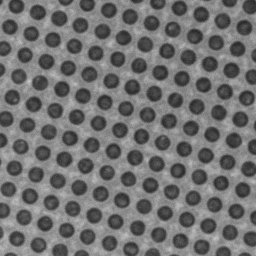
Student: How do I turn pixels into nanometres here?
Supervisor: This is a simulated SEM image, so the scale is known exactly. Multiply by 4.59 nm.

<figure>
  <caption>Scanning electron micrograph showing a regular array of holes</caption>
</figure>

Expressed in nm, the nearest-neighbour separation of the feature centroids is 101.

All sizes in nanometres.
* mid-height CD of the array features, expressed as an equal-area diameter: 75.7